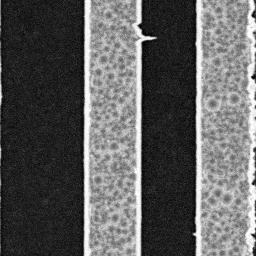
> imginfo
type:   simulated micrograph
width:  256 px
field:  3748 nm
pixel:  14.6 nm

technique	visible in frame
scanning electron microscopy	one or a few lines or trenches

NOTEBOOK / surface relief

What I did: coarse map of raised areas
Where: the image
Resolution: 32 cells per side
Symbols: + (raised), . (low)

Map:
...........++++++........++++++.
...........++++++........++++++.
...........++++++........++++++.
...........++++++........+++++++
...........+++++++.......++++++.
...........++++++........+++++++
...........++++++........+++++++
...........++++++........+++++++
...........++++++........++++++.
...........++++++........++++++.
...........++++++........++++++.
...........++++++........++++++.
...........++++++........+++++++
...........++++++........+++++++
...........++++++........+++++++
...........++++++........+++++++
...........++++++........++++++.
...........++++++........+++++++
...........++++++........+++++++
...........++++++........+++++++
...........++++++........++++++.
...........++++++........++++++.
...........++++++........++++++.
...........++++++........++++++.
...........++++++........+++++++
...........++++++........+++++++
...........++++++........+++++++
...........++++++........+++++++
...........++++++........+++++++
...........++++++........++++++.
...........++++++........++++++.
...........++++++........++++++.